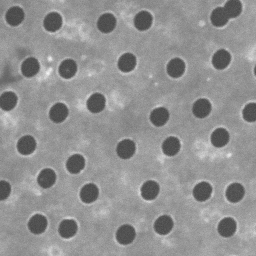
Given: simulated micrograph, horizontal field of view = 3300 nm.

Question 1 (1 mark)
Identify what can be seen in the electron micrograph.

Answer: a regular array of holes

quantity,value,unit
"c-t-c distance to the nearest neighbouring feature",476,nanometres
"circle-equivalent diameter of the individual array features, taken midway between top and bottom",266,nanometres